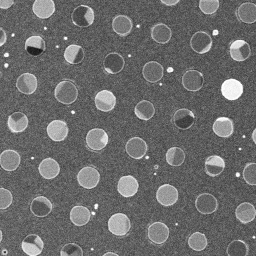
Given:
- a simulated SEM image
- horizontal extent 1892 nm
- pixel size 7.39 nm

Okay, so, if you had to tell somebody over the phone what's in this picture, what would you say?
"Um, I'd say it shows a regular array of raised bodies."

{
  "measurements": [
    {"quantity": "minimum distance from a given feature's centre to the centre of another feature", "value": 286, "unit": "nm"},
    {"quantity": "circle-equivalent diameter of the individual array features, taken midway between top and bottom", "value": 152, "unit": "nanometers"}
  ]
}